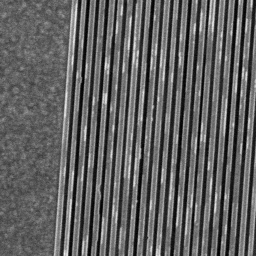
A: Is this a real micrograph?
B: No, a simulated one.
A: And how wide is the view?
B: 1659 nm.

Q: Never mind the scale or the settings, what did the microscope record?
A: parallel lines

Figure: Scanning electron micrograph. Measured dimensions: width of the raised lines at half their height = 36.4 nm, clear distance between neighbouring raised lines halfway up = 3.73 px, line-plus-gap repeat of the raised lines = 59.6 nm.